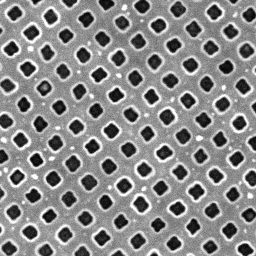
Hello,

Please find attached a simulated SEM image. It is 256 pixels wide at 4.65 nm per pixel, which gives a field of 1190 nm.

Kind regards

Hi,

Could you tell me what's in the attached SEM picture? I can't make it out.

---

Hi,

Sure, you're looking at a regular array of holes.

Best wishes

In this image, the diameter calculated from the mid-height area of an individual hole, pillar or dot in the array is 0.0674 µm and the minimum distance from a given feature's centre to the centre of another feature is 115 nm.